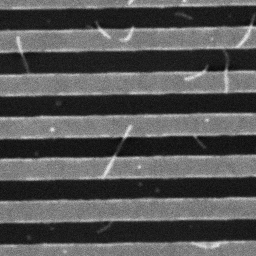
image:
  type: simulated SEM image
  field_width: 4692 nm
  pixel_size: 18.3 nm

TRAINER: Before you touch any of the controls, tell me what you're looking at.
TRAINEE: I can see lines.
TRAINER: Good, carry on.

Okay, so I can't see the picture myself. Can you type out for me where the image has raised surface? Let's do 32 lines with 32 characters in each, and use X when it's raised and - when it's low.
XXXXXXXXXXXXXXXXXXXXXXXXXXXXXXXX
--------------------------------
--------------------------------
----------------X----------X-XXX
XXXXXXXXXXXXXXXXXXXXXXXXXXXXXXXX
XXXXXXXXXXXXXXXXXXXXXXXXXXXXXXXX
XXX-----------------------------
--------------------------------
--------------------------------
XXXXXXXXXXXXXXXXXXXXXXXXXXXXXXXX
XXXXXXXXXXXXXXXXXXXXXXXXXXXXXXXX
XXXXXXXXXXXXXXXXXXXXXXXXXXXXX---
--------------------------------
--------------------------------
-----------XXXXXXXXXXXXXXXXXXXXX
XXXXXXXXXXXXXXXXXXXXXXXXXXXXXXXX
XXXXXXXXXXXXXXXXXXXXXXXXXXXXXXXX
--------------------------------
--------------------------------
----------------------------XXXX
XXXXXXXXXXXXXXXXXXXXXXXXXXXXXXXX
XXXXXXXXXXXXXXXXXXXXXXXXXXXXXXXX
--------------------------------
--------------------------------
--------------------------------
XXXXXXXXXXXXXXXXXXXXXXXXXXXXXXXX
XXXXXXXXXXXXXXXXXXXXXXXXXXXXXXXX
XXXXXXXXXXXXXXXXXXXXX-----------
--------------------------------
--------------------------------
--------------XXXXXXXXXXXXXXXXXX
XXXXXXXXXXXXXXXXXXXXXXXXXXXXXXXX